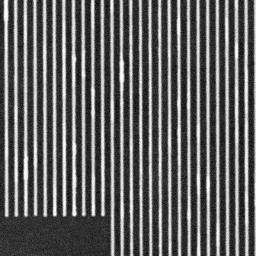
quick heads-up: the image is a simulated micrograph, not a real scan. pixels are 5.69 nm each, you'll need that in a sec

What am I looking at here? parallel lines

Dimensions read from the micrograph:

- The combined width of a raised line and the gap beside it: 9.6 px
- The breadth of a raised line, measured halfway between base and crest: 13.5 nm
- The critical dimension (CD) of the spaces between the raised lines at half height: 41.3 nm